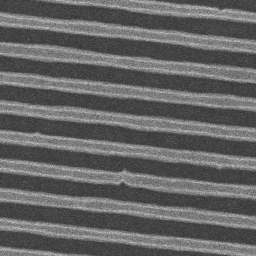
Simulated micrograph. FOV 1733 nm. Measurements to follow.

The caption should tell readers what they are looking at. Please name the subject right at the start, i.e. parallel lines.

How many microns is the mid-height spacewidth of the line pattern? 0.127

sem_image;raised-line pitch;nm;197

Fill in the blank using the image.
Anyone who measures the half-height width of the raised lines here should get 69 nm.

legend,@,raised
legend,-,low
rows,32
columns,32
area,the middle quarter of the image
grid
-------------@@@@@@@@@@@@@@@@@@@
----------------------@@@@@@@@@@
-------------------------------@
--------------------------------
@@@@@---------------------------
@@@@@@@@@@@@@@------------------
@@@@@@@@@@@@@@@@@@@@@-----------
--------@@@@@@@@@@@@@@@@@@@@@@-@
-------------------@@@@@@@@@@@@@
----------------------------@@@@
--------------------------------
@@@@----------------------------
@@@@@@@@@@@@--------------------
@@@@@@@@@@@@@@@@@@@@------------
----------@@@@@@@@@@@@@@@@@@@@@-
----------------@@@@@@@@@@@@@@@@
------------------------@@@@@@@@
--------------------------------
--------------------------------
@@@@@@@@@-----------------------
@@@@@@@@@@@@@@@@----------------
---@@@@@@@@@@@@@@@@@@@@@@-------
--------------@@@@@@@@@@@@@@@@@@
-----------------------@@@@@@@@@
-------------------------------@
--------------------------------
@@@@@@--------------------------
@@@@@@@@@@@@@@@@@---------------
-@@@@@@@@@@@@@@@@@@@@@@@--------
--------@@@@@@-@@@@@@@@@@@@@@@@@
-------------------@@@@@@@@@@@@@
------------------------@@@@@@@@